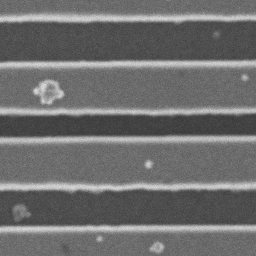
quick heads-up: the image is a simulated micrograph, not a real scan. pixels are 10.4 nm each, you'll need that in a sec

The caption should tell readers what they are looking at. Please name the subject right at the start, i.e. lines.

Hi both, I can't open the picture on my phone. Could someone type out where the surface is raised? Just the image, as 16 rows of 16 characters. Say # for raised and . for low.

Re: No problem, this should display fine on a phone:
################
................
................
................
################
################
################
................
................
################
################
################
................
................
################
################